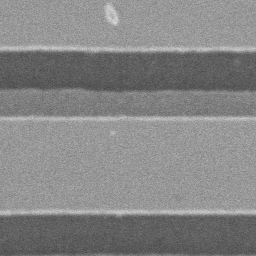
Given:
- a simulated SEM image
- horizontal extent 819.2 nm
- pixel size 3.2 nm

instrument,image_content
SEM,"lines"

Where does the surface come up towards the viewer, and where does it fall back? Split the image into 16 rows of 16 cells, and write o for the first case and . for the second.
oooooooooooooooo
oooooooooooooooo
oooooooooooooooo
................
................
................
................
oooooooooooooooo
oooooooooooooooo
oooooooooooooooo
oooooooooooooooo
oooooooooooooooo
oooooooooooooooo
................
................
................